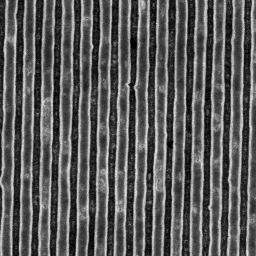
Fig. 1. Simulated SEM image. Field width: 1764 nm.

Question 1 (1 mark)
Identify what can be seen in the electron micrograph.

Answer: parallel lines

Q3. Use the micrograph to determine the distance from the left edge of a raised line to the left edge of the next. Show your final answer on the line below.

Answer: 131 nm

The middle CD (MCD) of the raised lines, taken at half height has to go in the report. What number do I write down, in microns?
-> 0.0689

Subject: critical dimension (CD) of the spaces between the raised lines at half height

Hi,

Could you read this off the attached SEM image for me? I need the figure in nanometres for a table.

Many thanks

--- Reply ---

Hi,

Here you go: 62.9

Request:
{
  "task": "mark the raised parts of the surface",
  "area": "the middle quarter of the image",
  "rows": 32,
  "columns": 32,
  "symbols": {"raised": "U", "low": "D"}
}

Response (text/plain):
UUDDUUUDDUUDDDUUDDUUUDDUUUDDUUDD
UUDDUUUDDUUDDDUUDDUUUDDUUDDDUUDD
UUDDUUUDDUUDDDUUDDUUUDDUUUDDUUDD
UUDDUUDDDUUDDDUUDDUUUDDUUUDDUUDD
UUDDUUDDDUUDDDUUDDUUUDDUUUDDUUDD
UUDDUUUDDUUDDDUUDDUUUDDUUUDDUUDD
UUDDUUUDDUUDDDUUDDUUUDDUUUDDUUDD
UUDDUUDDDUUDDDUUDDUUUDDUUUDDUUDD
UUDDUUDDDUUDDDUUDDUUUDDUUDDDUUDD
UUDDUUDDDUUDDDUUDDUUUDDUUUDDUUDD
UUDDUUDDDUUDDDUUDDUUUDDUUDDDUUDD
UUDDUUDDDUUDDDUUDDUUUDDUUDDDUUDD
UUDDUUDDDUUDDDUUDDUUUDDUUDDDUUDD
UUDDUUDDDUUDDDUUDDUUUDDUUDDDUUDD
UUDDUUDDDUUDDDUUDDUUUDDUUDDDUUDD
UUDDUUDDDUUDDDUUDDUUUDDUUDDUUUDD
UUDDUUDDDUUDDDUUDDUUUDDUUDDDUUDD
UDDDUUDDUUUDDDUUDDUUUDDUUDDDUUDD
UDDDUUDDUUUDDUUUDDUUUDDUUDDDUUDD
UUDDUUDDUUUDDUUUDDUUUDDUUDDDUUDD
UUDDUUDDDUUDDUUUDDUUUDDUUDDDUUDD
UUDDUUDDDUUDDUUUDDUUDDDUUDDDUUDD
UUDDUUDDDUUDDUUUDDUUDDDUUDDDUUDD
UDDDUUDDDUUDDUUDDDUUDDDUUDDDUUDD
UDDDUUDDDUUDDUUUDDUUDDDUUDDDUUDD
UDDDUUDDDUUDDUUDDDUUDDDUUDDDUUDD
UDDDUUDDDUUDDUUDDDUUDDDUUDDUUUDD
UDDDUUDDUUUDDUUUDDUUDDDUUDDUUUDD
UDDDUUDDUUUDDUUDDDUUDDDUUDDUUUDD
UDDDUUDDUUUDDUUDDDUUDDDUUDDUUUDD
UDDUUUDDUUUDDUUDDDUUDDDUUDDUUUDD
UDDUUUDDUUUDDUUDDDUUDDDUUDDUUUDD